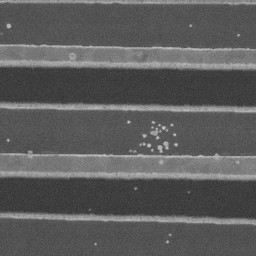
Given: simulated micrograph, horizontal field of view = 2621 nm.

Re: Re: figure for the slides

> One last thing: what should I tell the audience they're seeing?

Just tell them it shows lines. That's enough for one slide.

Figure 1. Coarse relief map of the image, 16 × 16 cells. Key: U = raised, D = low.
UUUUUUUUUUUUUUUU
UUUUUUUUUUUUUUUU
UUUUUUUUUUUUUUUU
UUUUUUUUUUUUUUUU
DDDDDDDDDDDDDDDD
DDDDDDDDDDDDDDDD
DDDDDDDDDDDDDDDD
UUUUUUUUUUUUUUUU
UUUUUUUUUUUUUUUU
UUUUUUUUUUUUUUUU
UUUUUUUUUUUUUUUU
DDDDDDDDDDDDDDDD
DDDDDDDDDDDDDDDD
DDDDDDDDDDDDDDDD
UUUUUUUUUUUUUUUU
UUUUUUUUUUUUUUUU